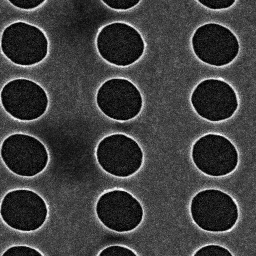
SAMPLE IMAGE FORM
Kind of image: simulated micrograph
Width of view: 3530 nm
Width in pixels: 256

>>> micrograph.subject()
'a regular array of holes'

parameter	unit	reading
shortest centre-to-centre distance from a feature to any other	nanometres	762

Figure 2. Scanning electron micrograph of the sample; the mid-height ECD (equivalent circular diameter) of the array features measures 611 nm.